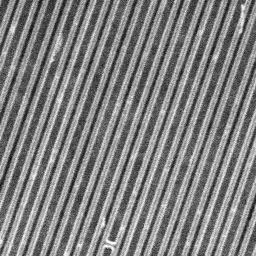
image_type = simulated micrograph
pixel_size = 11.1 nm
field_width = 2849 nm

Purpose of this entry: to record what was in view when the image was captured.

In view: parallel lines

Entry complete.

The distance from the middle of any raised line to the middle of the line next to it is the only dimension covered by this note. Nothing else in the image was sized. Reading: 124 nm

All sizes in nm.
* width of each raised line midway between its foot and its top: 47.3